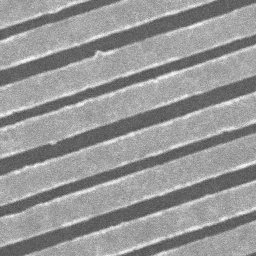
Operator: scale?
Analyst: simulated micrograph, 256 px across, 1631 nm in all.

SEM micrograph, parallel lines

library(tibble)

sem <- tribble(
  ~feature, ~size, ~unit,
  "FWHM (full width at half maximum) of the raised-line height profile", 177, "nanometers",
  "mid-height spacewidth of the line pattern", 13.1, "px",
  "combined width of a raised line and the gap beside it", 267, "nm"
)